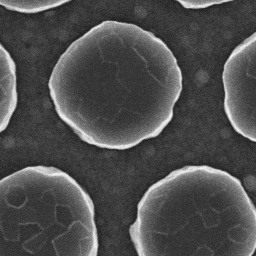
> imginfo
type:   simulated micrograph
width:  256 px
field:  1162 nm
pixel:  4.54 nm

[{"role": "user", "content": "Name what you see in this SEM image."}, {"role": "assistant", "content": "raised bodies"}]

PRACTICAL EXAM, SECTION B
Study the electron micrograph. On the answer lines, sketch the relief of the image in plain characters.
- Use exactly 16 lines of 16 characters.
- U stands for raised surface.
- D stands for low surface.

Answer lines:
DUUDDDDDDDDDDDDD
DDDDDDUUDDDDDDDD
DDDDDUUUUUDDDDDD
UDDDUUUUUUUDDDUU
UDDUUUUUUUUDDDUU
UDDUUUUUUUUDDDUU
UDDDUUUUUUUDDDUU
UDDDUUUUUUDDDDUU
DDDDDUUUUDDDDDDU
DDDDDDDDDDDDDDDD
DDDDDDDDDDDDUDDD
UUUUUDDDDDUUUUUD
UUUUUUDDDUUUUUUU
UUUUUUDDDUUUUUUU
UUUUUUDDUUUUUUUU
UUUUUUDDDUUUUUUU